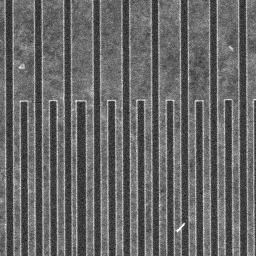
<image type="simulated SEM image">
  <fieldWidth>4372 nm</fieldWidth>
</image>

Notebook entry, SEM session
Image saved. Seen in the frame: parallel lines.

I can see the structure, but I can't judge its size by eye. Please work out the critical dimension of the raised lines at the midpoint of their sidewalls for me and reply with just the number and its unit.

137 nanometres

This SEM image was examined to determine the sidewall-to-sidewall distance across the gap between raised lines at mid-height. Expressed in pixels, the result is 6.5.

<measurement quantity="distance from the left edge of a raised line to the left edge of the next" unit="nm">249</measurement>